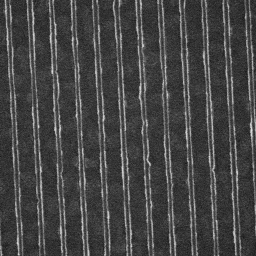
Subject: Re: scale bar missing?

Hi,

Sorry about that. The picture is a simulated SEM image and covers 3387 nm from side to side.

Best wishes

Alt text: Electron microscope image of parallel lines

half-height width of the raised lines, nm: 69.3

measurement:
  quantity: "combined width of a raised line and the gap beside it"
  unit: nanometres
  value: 288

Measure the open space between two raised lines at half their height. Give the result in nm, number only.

218